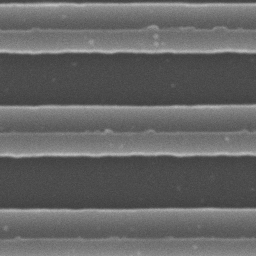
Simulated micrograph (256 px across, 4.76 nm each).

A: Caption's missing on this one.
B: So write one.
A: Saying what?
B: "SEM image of lines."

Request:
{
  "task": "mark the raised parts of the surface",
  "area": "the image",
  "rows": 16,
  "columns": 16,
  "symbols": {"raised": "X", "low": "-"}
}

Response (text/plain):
XXXXXXXXXXXXXXXX
XXXXXXXXXXXXXXXX
XXXXXXXXXXXXXXXX
----------------
----------------
----------------
----------------
XXXXXXXXXXXXXXXX
XXXXXXXXXXXXXXXX
XXXXXXXXXXXXXXXX
----------------
----------------
----------------
XXXXXXXXXXXXXXXX
XXXXXXXXXXXXXXXX
XXXXXXXXXXXXXXXX